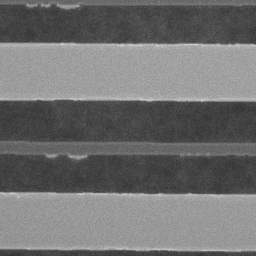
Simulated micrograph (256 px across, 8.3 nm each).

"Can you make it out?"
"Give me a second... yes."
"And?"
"lines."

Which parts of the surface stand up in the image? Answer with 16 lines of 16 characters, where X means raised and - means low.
----------------
----------------
----------------
XXXXXXXXXXXXXXXX
XXXXXXXXXXXXXXXX
XXXXXXXXXXXXXXXX
----------------
----------------
----------------
----------------
----------------
----------------
XXXXXXXXXXXXXXXX
XXXXXXXXXXXXXXXX
XXXXXXXXXXXXXXXX
XXXXXXXXXXXXXXXX